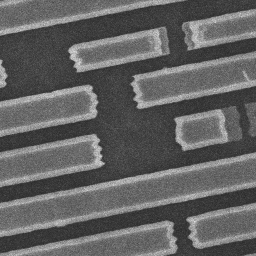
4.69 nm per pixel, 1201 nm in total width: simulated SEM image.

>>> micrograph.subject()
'parallel lines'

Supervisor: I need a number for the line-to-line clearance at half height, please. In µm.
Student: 0.0949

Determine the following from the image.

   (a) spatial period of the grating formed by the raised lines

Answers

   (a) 230 nanometers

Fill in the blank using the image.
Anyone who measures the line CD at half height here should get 140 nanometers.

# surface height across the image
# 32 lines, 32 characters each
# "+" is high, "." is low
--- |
+++++++++++++++++++.............
+++++++++++++..................+
+++++++++.................++++++
+++.....................++++++++
................++++....+++++++.
...........+++++++++.....+......
.........+++++++++++............
.........+++++++............++++
..........+............+++++++++
+.................++++++++++++++
.................+++++++++++++++
........+++......++++++++++.....
...+++++++++.....+++++..........
++++++++++++....................
+++++++++++.............++++....
+++++++...............++++++....
++....................++++++....
.........+++..........++++++....
....++++++++....................
++++++++++++...................+
++++++++++++..............++++++
++++++++.............+++++++++++
+++.............++++++++++++++++
...........+++++++++++++++++++..
......+++++++++++++++++++.......
.+++++++++++++++++++............
+++++++++++++++............+++++
++++++++++..............++++++++
+++++.............+++...++++++++
............++++++++++..++++++++
.......+++++++++++++++..+++.....
..+++++++++++++++++++...........